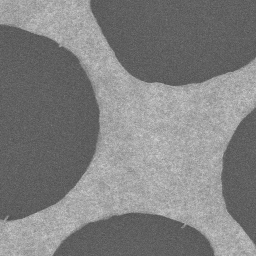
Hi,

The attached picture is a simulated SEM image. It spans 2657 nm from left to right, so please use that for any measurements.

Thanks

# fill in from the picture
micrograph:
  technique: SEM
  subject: holes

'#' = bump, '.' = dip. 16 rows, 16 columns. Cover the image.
######..........
######..........
...####.........
.....##.........
......##......##
......##########
......##########
......#########.
......#########.
......########..
.....#########..
.....#########..
....##########..
..#####...####..
####........###.
####.........###